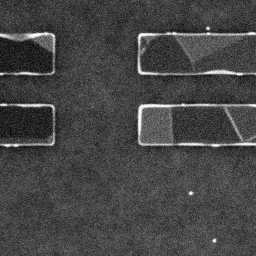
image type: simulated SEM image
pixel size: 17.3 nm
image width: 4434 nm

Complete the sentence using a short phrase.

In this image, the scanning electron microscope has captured groups of lines, slits or small figures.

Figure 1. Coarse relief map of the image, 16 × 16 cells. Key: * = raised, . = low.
................
................
***......*******
***......*******
***......*******
................
................
***......*******
***......*******
................
................
................
................
................
................
................